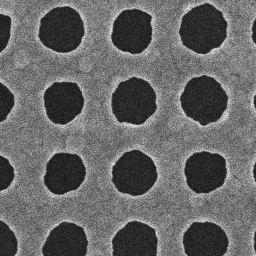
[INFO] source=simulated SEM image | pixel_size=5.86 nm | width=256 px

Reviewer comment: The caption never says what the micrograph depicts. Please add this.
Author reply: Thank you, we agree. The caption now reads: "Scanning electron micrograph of a regular array of holes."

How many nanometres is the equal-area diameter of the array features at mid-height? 263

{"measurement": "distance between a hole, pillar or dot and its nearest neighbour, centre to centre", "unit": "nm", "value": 411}